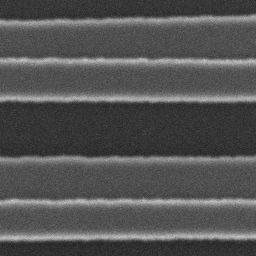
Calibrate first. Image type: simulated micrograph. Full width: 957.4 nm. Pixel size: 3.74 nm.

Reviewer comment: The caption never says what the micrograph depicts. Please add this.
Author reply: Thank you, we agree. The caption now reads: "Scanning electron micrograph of lines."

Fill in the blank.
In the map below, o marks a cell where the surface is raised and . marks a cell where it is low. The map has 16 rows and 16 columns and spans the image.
................
oooooooooooooooo
oooooooooooooooo
oooooooooooooooo
oooooooooooooooo
oooooooooooooooo
................
................
................
................
oooooooooooooooo
oooooooooooooooo
oooooooooooooooo
oooooooooooooooo
oooooooooooooooo
................